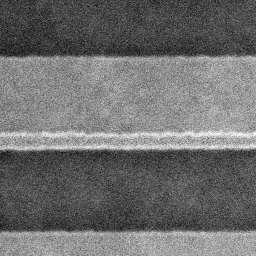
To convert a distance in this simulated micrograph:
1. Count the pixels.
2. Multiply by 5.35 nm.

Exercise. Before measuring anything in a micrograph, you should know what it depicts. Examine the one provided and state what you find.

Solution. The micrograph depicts lines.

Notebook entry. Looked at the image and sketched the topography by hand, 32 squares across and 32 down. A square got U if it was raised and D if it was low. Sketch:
DDDDDDDDDDDDDDDDDDDDDDDDDDDDDDDD
DDDDDDDDDDDDDDDDDDDDDDDDDDDDDDDD
DDDDDDDDDDDDDDDDDDDDDDDDDDDDDDDD
DDDDDDDDDDDDDDDDDDDDDDDDDDDDDDDD
DDDDDDDDDDDDDDDDDDDDDDDDDDDDDDDD
DDDDDDDDDDDDDDDDDDDDDDDDDDDDDDDD
DDDDDDDDDDDDDDDDDDDDDDDDDDDDDDDD
UUUUUUUUUUUUUUUUUUUUUUUUUUUUUUUU
UUUUUUUUUUUUUUUUUUUUUUUUUUUUUUUU
UUUUUUUUUUUUUUUUUUUUUUUUUUUUUUUU
UUUUUUUUUUUUUUUUUUUUUUUUUUUUUUUU
UUUUUUUUUUUUUUUUUUUUUUUUUUUUUUUU
UUUUUUUUUUUUUUUUUUUUUUUUUUUUUUUU
UUUUUUUUUUUUUUUUUUUUUUUUUUUUUUUU
UUUUUUUUUUUUUUUUUUUUUUUUUUUUUUUU
UUUUUUUUUUUUUUUUUUUUUUUUUUUUUUUU
UUUUUUUUUUUUUUUUUUUUUUUUUUUUUUUU
UUUUUUUUUUUUUUUUUUUUUUUUUUUUUUUU
UUUUUUUUUDDUDUDUUDDDUDDDDDDDDDDD
DDDDDDDDDDDDDDDDDDDDDDDDDDDDDDDD
DDDDDDDDDDDDDDDDDDDDDDDDDDDDDDDD
DDDDDDDDDDDDDDDDDDDDDDDDDDDDDDDD
DDDDDDDDDDDDDDDDDDDDDDDDDDDDDDDD
DDDDDDDDDDDDDDDDDDDDDDDDDDDDDDDD
DDDDDDDDDDDDDDDDDDDDDDDDDDDDDDDD
DDDDDDDDDDDDDDDDDDDDDDDDDDDDDDDD
DDDDDDDDDDDDDDDDDDDDDDDDDDDDDDDD
DDDDDDDDDDDDDDDDDDDDDDDDDDDDDDDD
DDDDDDDDDDDDDDDDDDDDDDDDDDDDDDDD
UUUUUUUUUUUUUUUUUUUUUUUUUUUUUUUU
UUUUUUUUUUUUUUUUUUUUUUUUUUUUUUUU
UUUUUUUUUUUUUUUUUUUUUUUUUUUUUUUU